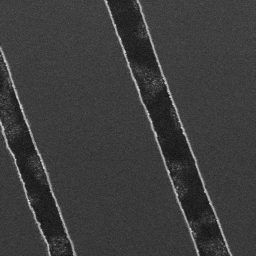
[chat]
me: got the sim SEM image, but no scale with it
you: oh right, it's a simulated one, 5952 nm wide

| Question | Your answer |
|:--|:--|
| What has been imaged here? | one or a few lines or trenches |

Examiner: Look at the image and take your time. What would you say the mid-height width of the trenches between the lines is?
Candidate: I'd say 2.69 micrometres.